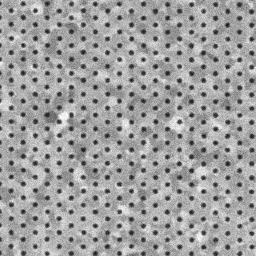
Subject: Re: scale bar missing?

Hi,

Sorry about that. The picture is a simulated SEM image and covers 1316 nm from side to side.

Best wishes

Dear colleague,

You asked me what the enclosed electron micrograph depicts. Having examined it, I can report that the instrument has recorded a regular array of holes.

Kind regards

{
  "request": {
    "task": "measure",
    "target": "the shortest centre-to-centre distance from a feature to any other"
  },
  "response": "0.0697 um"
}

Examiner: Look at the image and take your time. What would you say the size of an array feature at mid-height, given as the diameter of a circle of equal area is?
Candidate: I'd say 30.1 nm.